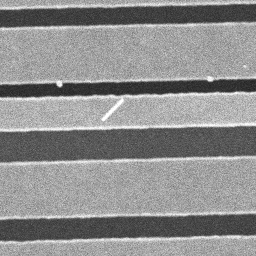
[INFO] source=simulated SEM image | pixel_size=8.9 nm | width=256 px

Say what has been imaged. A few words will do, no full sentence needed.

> lines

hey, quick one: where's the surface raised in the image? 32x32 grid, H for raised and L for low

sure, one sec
HHHHHHHHHHHHHHHHHHHHHHHHHHHHHLLL
LLLLLLLLLLLLLLLLLLLLLLLLLLLLLLLL
LLLLLLLLLLLLLLLLLLLLLLLLLLLLLLLL
LLHHHHHHHHHHHHHHHHHHHHHHHHHHHHHH
HHHHHHHHHHHHHHHHHHHHHHHHHHHHHHHH
HHHHHHHHHHHHHHHHHHHHHHHHHHHHHHHH
HHHHHHHHHHHHHHHHHHHHHHHHHHHHHHHH
HHHHHHHHHHHHHHHHHHHHHHHHHHHHHHHH
HHHHHHHHHHHHHHHHHHHHHHHHHHHHHHHH
HHHHHHHHHHHHHHHHHHHHHHHHHHHHHHHH
LHLLLLLHLLLLLLLLLLLLLLLLLLLLLLLL
LLLLLLLLLLLLLLLLLLLLLLLLLLLLLLLL
HHHHHHHHHHHHHHHHHHHHHHHHHHHHHHHH
HHHHHHHHHHHHHHHHHHHHHHHHHHHHHHHH
HHHHHHHHHHHHHHHHHHHHHHHHHHHHHHHH
HHHHHHHHHHHHHHHHHHHHHHHHHHHHHHHH
LLLLLLLLLLLLLLLLLLLLLLLLLLLLLLLL
LLLLLLLLLLLLLLLLLLLLLLLLLLLLLLLL
LLLLLLLLLLLLLLLLLLLLLLLLLLLLLLLL
LLLLLLLLLLLLLLLLLLLLLLLLLLLLLLLL
HHHHHHHHHHHHHHHHHHHHHHHHHHHHHHHH
HHHHHHHHHHHHHHHHHHHHHHHHHHHHHHHH
HHHHHHHHHHHHHHHHHHHHHHHHHHHHHHHH
HHHHHHHHHHHHHHHHHHHHHHHHHHHHHHHH
HHHHHHHHHHHHHHHHHHHHHHHHHHHHHHHH
HHHHHHHHHHHHHHHHHHHHHHHHHHHHHHHH
HHHHHHHHHHHHHHHHHHHHHHHHHHHHHHHH
LLLLLLLLLLLLLLLLLLLLLLLLLLLLLLLL
LLLLLLLLLLLLLLLLLLLLLLLLLLLLLLLL
LLLLLLLLLLLLLLLLLLLLLLLLLLHHHHHH
HHHHHHHHHHHHHHHHHHHHHHHHHHHHHHHH
HHHHHHHHHHHHHHHHHHHHHHHHHHHHHHHH